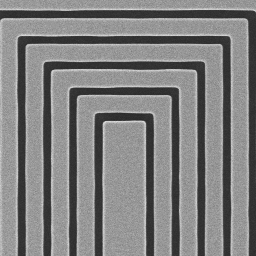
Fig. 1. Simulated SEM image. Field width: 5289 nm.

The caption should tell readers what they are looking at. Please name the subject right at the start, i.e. groups of lines, slits or small figures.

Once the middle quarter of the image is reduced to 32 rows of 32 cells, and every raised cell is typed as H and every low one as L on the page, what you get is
LLLLLLLLLLLLLLLLLLLLLLLLLLLLLLLL
HHHHHHHHHHHHHHHHHLLLLLLLHHHHHHHL
HHHHHHHHHHHHHHHHHHHHHHHHHHHHHHHH
HHHHHHHHHHHHHHHHHHHHHHHHHHHHHHHH
HHHHHHHHHHHHHHHHHHHHHHHHHHHHHHHH
HHHHHHHHHHHHHHHHHHHHHHHHHHHHHHHH
HLLLLLLLLLLLLLLLLLLLLLLLLLLLLHHH
HLLLLLLLLLLLLLLLLLLLLLLLLLLLLHHH
HLLHHHHHHHHHHHHHHHHHHHHHHHHLLHHH
HLLHHHHHHHHHHHHHHHHHHHHHHHHLLHHH
HLLHHHHHHHHHHHHHHHHHHHHHHHHLLHHH
HLLHHHHHHHHHHHHHHHHHHHHHHHHLLHHH
HLLHHHHHLLLLLLLLLLLLLLHHHHHLLHHH
HLLHHHHHLLLLLLLLLLLLLLLHHHHLLHHH
HLLHHHHHLLHHHHHHHHHHLLLHHHHLLHHH
HLLHHHHHLLHHHHHHHHHHLLLHHHHLLHHH
HLLHHHHHLLHHHHHHHHHHLLLHHHHLLHHH
HLLHHHHHLLHHHHHHHHHHLLLHHHHLLHHH
HLLHHHHHLLHHHHHHHHHHLLLHHHHLLHHH
HLLHHHHHLLHHHHHHHHHHLLLHHHHLLHHH
HLLHHHHHLLHHHHHHHHHHLLLHHHHLLHHH
HLLHHHHHLLHHHHHHHHHHLLLHHHHLLHHH
HLLHHHHHLLHHHHHHHHHHLLLHHHHLLHHH
HLLHHHHHLLHHHHHHHHHHLLLHHHHLLHHH
HLLHHHHHLLHHHHHHHHHHLLLHHHHLLHHH
HLLHHHHHLLHHHHHHHHHHLLLHHHHLLHHH
HLLHHHHHLLHHHHHHHHHHLLLHHHHLLHHH
HLLHHHHHLLHHHHHHHHHHLLLHHHHLLHHH
HLLHHHHHLLHHHHHHHHHHLLLHHHHLLHHH
HLLHHHHHLLHHHHHHHHHHLLLHHHHLLHHH
HLLHHHHHLLHHHHHHHHHHLLLHHHHLLHHH
HLLHHHHHLLHHHHHHHHHHLLLHHHHLLHHH